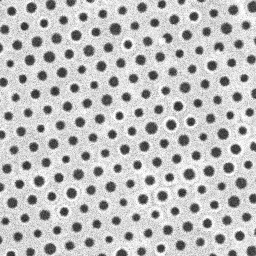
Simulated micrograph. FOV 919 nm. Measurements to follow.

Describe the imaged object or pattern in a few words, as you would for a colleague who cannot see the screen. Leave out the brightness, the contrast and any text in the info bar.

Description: a regular array of holes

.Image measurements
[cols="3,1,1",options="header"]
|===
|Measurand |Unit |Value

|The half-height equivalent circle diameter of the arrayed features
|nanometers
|35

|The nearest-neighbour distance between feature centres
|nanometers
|70.5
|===